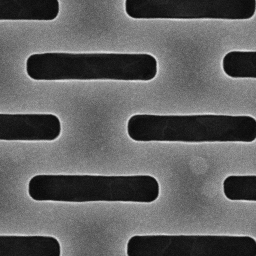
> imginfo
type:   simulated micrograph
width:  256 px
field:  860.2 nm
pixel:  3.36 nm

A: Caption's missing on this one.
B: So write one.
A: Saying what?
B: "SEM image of holes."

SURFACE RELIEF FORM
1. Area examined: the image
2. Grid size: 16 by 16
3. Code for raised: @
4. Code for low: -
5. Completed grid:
----@@@@--------
@@@@@@@@@@@@@@@@
@@@@@@@@@@@@@@@@
@@-------@@@@@--
@@--------@@@@--
@@@@@@@@@@@@@@@@
@@@@@@@@@@@@@@@@
----@@@@--------
---@@@@@--------
@@@@@@@@@@@@@@@@
@@@@@@@@@@@@@@@@
@@--------@@@@--
@@--------@@@@@-
@@@@@@@@@@@@@@@@
@@@@@@@@@@@@@@@@
----@@@@--------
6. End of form